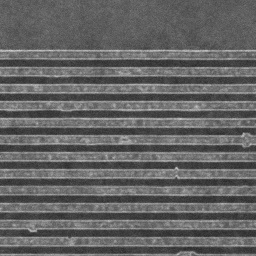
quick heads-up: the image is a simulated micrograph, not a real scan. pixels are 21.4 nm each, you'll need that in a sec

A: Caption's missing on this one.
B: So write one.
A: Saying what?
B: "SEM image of parallel lines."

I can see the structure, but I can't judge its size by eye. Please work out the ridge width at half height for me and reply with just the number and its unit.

0.187 µm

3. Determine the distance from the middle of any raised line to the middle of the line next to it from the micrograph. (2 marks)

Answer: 363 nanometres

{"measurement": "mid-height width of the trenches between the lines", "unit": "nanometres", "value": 185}